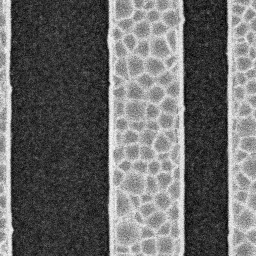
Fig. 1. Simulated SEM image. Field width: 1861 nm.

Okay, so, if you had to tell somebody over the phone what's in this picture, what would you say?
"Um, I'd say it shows one or a few lines or trenches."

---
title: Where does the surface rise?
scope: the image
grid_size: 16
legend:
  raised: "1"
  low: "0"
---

0000000111100011
0000000111100011
0000000111100011
1000000111100011
0000000111100011
1000000111100011
1000000111100011
1000000111100011
0000000111100011
0000000111100011
0000000111100011
0000000111100011
0000000111100011
1000000111100011
1000000111100011
1000000111100011